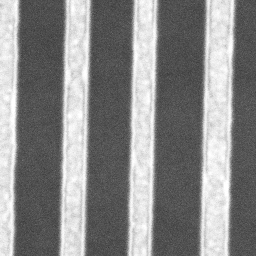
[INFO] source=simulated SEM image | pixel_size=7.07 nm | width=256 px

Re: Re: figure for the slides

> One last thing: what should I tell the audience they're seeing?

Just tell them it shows one or a few lines or trenches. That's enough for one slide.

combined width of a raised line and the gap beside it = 493 nm